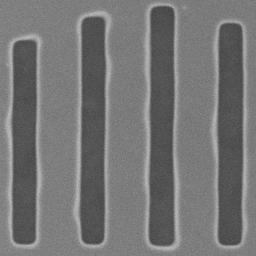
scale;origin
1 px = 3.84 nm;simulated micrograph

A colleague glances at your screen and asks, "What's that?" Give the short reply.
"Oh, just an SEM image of groups of lines, slits or small figures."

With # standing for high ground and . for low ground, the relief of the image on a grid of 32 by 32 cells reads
################################
###################...##########
##########...######...##########
##########...######...#####...##
##########...######...#####...##
##...#####...######...#####...##
#....#####...######...#####...##
#....#####...######...#####...##
##...#####...######...#####...##
##...#####...######...#####...##
##...#####...######...#####...##
##...#####...######...#####...##
##...#####...######...#####...##
#....#####...######...#####...##
#....#####...#####....#####...##
#....#####...######...#####...##
#....#####...######...#####...##
#....#####...######...#####...##
#....#####...######...#####...##
#....#####...######...#####...##
#....#####...######...#####...##
#....#####...#####....#####...##
#....#####...#####....#####...##
#....#####...######...#####...##
#....#####...######...#####...##
#....#####...######...#####...##
#....#####...######...#####...##
#....#####...######...#####...##
#....#####...#####....#####...##
##...#####...######...#####...##
##..#######.#######...######..##
################################